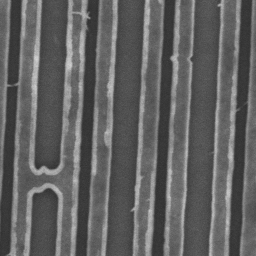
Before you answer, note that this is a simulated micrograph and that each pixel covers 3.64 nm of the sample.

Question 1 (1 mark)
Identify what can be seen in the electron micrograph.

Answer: parallel lines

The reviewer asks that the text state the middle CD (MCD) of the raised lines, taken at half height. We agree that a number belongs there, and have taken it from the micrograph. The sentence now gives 64.9 nm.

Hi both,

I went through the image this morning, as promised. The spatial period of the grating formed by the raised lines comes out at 145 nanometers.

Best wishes